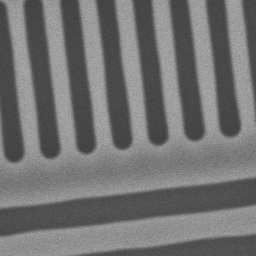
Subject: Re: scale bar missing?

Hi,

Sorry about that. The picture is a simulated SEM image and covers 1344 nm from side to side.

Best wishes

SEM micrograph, groups of lines, slits or small figures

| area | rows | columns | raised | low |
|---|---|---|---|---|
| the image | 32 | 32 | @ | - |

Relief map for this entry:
-@@--@@@--@@--@@@--@@---@@--@@--
-@@---@@--@@--@@@--@@---@@--@@--
-@@---@@--@@---@@--@@---@@--@@@-
-@@---@@--@@---@@--@@---@@---@@-
-@@---@@--@@@--@@--@@@--@@---@@-
--@---@@---@@--@@---@@--@@---@@-
--@@--@@---@@--@@---@@--@@---@@-
--@@--@@---@@--@@---@@--@@@--@@-
--@@--@@---@@--@@@--@@---@@--@@-
--@@--@@@--@@---@@--@@---@@--@@-
--@@---@@--@@---@@--@@---@@--@@-
--@@---@@--@@---@@--@@---@@--@@@
--@@---@@--@@---@@--@@---@@---@@
--@@---@@---@---@@---@@--@@---@@
--@@@--@@---@@--@@---@@--@@---@@
---@@--@@---@@--@@---@@---@---@@
---@@--@@---@@--@@---@@---@@--@@
---@@--@@---@@---@@--@@@-@@@@@@@
---@@---@@--@@@-@@@@@@@@@@@@@@@@
@--@@--@@@@@@@@@@@@@@@@@@@@@@@@@
@@@@@@@@@@@@@@@@@@@@@@@@@@@@@@@@
@@@@@@@@@@@@@@@@@@@@@@@@@@@@@@@@
@@@@@@@@@@@@@@@@@@@@@@@@@@@@@@--
@@@@@@@@@@@@@@@@@@@@@-----------
@@@@@@@@@@@@@-------------------
@@@@----------------------------
--------------------------@@@@@@
-----------------@@@@@@@@@@@@@@@
---------@@@@@@@@@@@@@@@@@@@@@@@
-@@@@@@@@@@@@@@@@@@@@@@@@@@-----
@@@@@@@@@@@@@@@@@@@@@-----------
@@@@@@@@@@@@--------------------